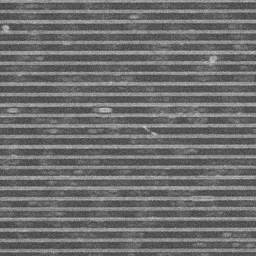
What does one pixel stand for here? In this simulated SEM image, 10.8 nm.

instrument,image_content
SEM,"parallel lines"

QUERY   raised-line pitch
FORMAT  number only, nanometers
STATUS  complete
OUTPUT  112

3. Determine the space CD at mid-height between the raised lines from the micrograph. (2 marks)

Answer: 80.9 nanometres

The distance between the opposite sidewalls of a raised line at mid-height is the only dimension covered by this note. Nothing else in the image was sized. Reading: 29.7 nanometers